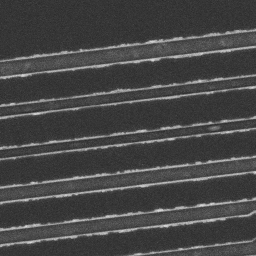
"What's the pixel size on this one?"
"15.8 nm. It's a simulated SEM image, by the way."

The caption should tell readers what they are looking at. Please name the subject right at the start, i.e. parallel lines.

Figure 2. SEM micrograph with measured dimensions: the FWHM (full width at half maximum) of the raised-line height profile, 467 nm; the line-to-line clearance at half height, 218 nm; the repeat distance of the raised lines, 41.3 pixels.